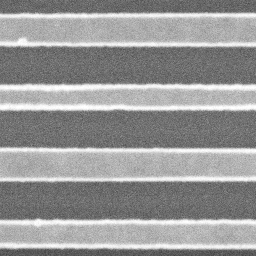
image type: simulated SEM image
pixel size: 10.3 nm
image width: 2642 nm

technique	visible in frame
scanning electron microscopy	lines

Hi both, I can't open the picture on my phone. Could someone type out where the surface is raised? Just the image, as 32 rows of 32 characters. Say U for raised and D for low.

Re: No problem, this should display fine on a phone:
DDDDDDDDDDDDDDDDDDDDDDDDDDDDDDDD
DDDDDDDDDDDDDDDDDDDDDDDDDDDDDDDD
UUUUUUUUUUUUUUUUUUUUUUUUUUUUUUUU
UUUUUUUUUUUUUUUUUUUUUUUUUUUUUUUU
UUUUUUUUUUUUUUUUUUUUUUUUUUUUUUUU
UUUUUUUUUUUUUUUUUUUUUUUUUUUUUUUU
DDDDDDDDDDDDDDDDDDDDDDDDDDDDDDDD
DDDDDDDDDDDDDDDDDDDDDDDDDDDDDDDD
DDDDDDDDDDDDDDDDDDDDDDDDDDDDDDDD
DDDDDDDDDDDDDDDDDDDDDDDDDDDDDDDD
DDDDDDDDDDDDDDDDDDDDDDDDDDDDDDDD
UUUUUUUUUUUUUUUUUUUUUUUUUUUUUUUU
UUUUUUUUUUUUUUUUUUUUUUUUUUUUUUUU
UUUUUUUUUUUUUUUUUUUUUUUUUUUUUUUU
DDDDDDDDDDDDDDDDDDDDDDDDDDDDDDDD
DDDDDDDDDDDDDDDDDDDDDDDDDDDDDDDD
DDDDDDDDDDDDDDDDDDDDDDDDDDDDDDDD
DDDDDDDDDDDDDDDDDDDDDDDDDDDDDDDD
DDDDDDDDDDDDDDDDDDDDDDDDDDDDDDDD
UUUUUUUUUUUUUUUUUUUUUUUUUUUUUUUU
UUUUUUUUUUUUUUUUUUUUUUUUUUUUUUUU
UUUUUUUUUUUUUUUUUUUUUUUUUUUUUUUU
UUUUUUUUUUUUUUUUUUUUUUUUUUUUUUUU
DDDDDDDDDDDDDDDDDDDDDDDDDDDDDDDD
DDDDDDDDDDDDDDDDDDDDDDDDDDDDDDDD
DDDDDDDDDDDDDDDDDDDDDDDDDDDDDDDD
DDDDDDDDDDDDDDDDDDDDDDDDDDDDDDDD
DDDDUDDDDDDDDDDDDDDDDDDDDDDDDDDD
UUUUUUUUUUUUUUUUUUUUUUUUUUUUUUUU
UUUUUUUUUUUUUUUUUUUUUUUUUUUUUUUU
UUUUUUUUUUUUUUUUUUUUUUUUUUUUUUUU
DDDDDDDDDDDDDDDDDDDDDDDDDDDDDDDD